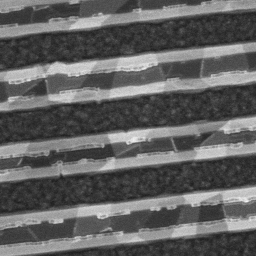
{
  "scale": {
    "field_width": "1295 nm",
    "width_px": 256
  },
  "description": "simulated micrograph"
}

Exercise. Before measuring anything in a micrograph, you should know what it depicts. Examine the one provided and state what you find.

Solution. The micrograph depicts one or a few lines or trenches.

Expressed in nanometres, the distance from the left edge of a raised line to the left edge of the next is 366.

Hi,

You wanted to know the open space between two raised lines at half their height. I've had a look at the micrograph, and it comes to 0.211 um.